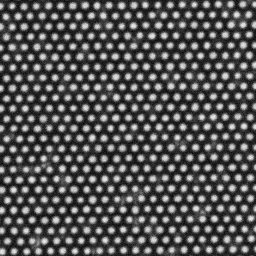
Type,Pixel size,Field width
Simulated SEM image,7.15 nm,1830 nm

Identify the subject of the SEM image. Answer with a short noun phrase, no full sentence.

a regular array of raised bodies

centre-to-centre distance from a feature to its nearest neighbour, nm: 81.2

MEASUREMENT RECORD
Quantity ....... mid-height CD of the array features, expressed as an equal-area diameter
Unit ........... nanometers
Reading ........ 41.9